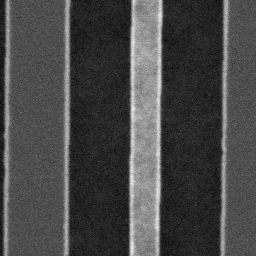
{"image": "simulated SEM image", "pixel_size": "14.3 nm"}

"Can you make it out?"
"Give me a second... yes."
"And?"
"lines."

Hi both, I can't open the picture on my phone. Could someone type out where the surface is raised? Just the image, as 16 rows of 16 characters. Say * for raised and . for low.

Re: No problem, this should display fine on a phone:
****....**....**
****....**....**
****....**....**
****....**....**
****....**....**
****....**....**
****....**....**
****....**....**
****....**....**
****....**....**
****....**....**
****....**....**
****....**....**
****....**....**
****....**....**
****....**....**